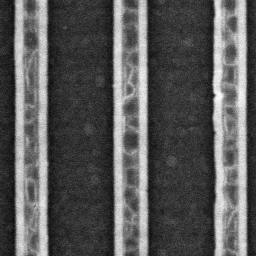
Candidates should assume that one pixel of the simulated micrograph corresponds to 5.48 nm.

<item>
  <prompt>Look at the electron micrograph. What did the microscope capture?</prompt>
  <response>one or a few lines or trenches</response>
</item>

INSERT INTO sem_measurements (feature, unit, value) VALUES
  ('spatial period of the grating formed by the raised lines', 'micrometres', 0.545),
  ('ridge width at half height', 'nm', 131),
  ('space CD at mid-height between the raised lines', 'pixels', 75.9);